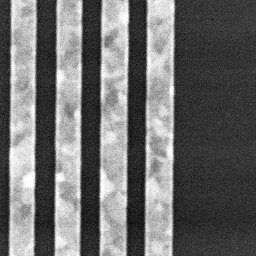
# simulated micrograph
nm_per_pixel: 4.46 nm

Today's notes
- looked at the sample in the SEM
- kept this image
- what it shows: wiring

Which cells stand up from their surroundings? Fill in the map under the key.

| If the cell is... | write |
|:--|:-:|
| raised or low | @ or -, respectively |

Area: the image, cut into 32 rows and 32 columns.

--@@---@@@---@@@---@@@----------
--@@---@@@---@@@---@@@----------
--@@---@@@---@@@---@@@----------
--@@---@@@---@@@---@@@----------
--@@---@@@---@@@---@@@----------
-@@@---@@@---@@@---@@@----------
-@@@---@@@---@@@---@@@----------
--@@---@@@---@@@---@@@----------
--@@---@@@---@@@--@@@@----------
-@@@---@@@---@@@--@@@@----------
-@@@---@@@---@@@--@@@@----------
-@@@---@@@---@@@--@@@@----------
-@@@---@@@---@@@--@@@@----------
-@@@---@@@---@@@--@@@@----------
-@@@---@@@---@@@--@@@@----------
-@@@---@@@---@@@--@@@@----------
-@@@---@@@---@@@--@@@@----------
-@@@---@@@---@@@--@@@@----------
-@@@---@@@---@@@--@@@-----------
-@@@---@@@---@@@--@@@@----------
-@@@---@@@---@@@--@@@@----------
-@@@---@@@---@@@--@@@-----------
-@@@---@@@---@@@--@@@-----------
-@@@---@@@---@@@--@@@-----------
-@@@---@@@---@@@--@@@-----------
-@@@---@@@---@@@--@@@-----------
-@@@---@@@---@@@--@@@-----------
-@@@---@@@---@@@--@@@-----------
-@@@---@@@---@@@--@@@-----------
-@@@---@@@---@@@--@@@-----------
-@@@---@@@---@@@--@@@-----------
-@@@---@@@---@@@--@@@-----------